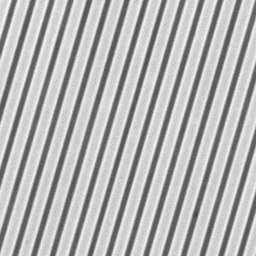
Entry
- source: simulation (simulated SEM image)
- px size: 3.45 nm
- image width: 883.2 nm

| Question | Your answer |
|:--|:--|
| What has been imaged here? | parallel lines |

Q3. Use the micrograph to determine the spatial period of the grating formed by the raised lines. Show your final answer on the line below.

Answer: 62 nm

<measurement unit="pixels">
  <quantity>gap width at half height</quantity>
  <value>6.96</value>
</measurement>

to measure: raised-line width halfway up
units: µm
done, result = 0.0381